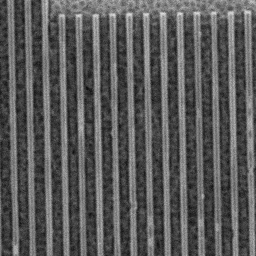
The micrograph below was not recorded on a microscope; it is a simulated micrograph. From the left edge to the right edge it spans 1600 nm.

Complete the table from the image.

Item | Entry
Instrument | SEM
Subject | parallel lines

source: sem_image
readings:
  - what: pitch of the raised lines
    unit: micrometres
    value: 0.106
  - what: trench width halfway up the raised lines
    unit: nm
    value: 74.9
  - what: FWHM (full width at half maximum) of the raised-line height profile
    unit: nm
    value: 28.9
